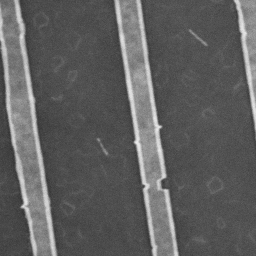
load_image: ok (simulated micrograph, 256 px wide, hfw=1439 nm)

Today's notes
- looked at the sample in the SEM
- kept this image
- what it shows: one or a few lines or trenches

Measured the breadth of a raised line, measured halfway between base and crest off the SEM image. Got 118 nm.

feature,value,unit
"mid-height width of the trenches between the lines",557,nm